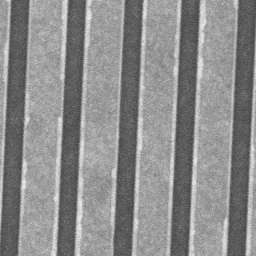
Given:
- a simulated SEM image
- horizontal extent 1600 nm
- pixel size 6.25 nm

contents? parallel lines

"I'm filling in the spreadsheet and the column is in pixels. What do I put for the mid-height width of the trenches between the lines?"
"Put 19.7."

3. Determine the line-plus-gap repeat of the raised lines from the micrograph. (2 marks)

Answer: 355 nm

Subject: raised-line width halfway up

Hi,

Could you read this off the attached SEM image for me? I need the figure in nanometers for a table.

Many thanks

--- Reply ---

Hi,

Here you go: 228